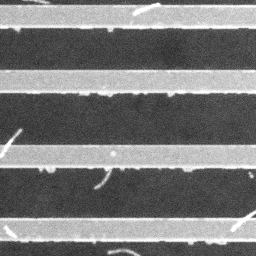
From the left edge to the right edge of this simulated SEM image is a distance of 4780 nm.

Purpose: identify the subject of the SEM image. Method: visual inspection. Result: lines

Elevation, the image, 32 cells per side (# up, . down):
...................#............
################################
################################
................................
................................
................................
................................
................................
................................
################################
################################
................................
................................
................................
................................
................................
................................
................................
################################
################################
################################
................................
................................
................................
................................
................................
................................
################################
################################
################################
................................
................................